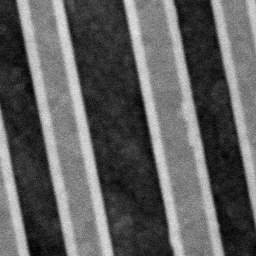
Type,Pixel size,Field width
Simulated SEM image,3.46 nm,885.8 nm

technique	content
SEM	one or a few lines or trenches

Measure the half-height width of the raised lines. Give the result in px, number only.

35.4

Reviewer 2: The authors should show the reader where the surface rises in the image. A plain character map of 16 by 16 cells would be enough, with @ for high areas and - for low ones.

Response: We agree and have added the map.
-@@@----@@@---@@
--@@----@@@---@@
--@@-----@@---@@
--@@-----@@---@@
--@@@----@@---@@
--@@@----@@@---@
---@@----@@@---@
---@@----@@@---@
---@@-----@@---@
---@@@----@@---@
---@@@----@@@---
@---@@----@@@---
@---@@----@@@---
@---@@-----@@---
@---@@-----@@---
@---@@@----@@@--